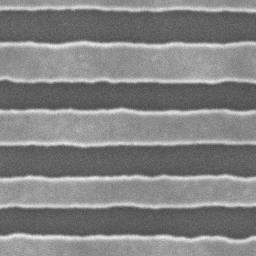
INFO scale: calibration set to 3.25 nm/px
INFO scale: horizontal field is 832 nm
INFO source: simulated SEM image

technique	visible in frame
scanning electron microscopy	lines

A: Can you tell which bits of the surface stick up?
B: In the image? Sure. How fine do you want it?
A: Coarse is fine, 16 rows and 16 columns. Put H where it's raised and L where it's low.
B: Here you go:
HHHHHHHHHHHHHHHH
LLLLLLLLLLLLLLLL
LLLLLLLLLLLLLLLL
HHHHHHHHHHHHHHHH
HHHHHHHHHHHHHHHH
LLLLLLLLLLLLLLLL
LLLLLLLLLLLLLLLL
HHHHHHHHHHHHHHHH
HHHHHHHHHHHHHHHH
LLLLLLLLLLLLLLLL
LLLLLLLLLLLLLLLL
HHHHHHHHHHHHHHHH
HHHHHHHHHHHHHHHH
LLLLLLLLLLLLLLLL
LLLLLLLLLLLLLLLL
HHHHHHHHHHHHHHHH